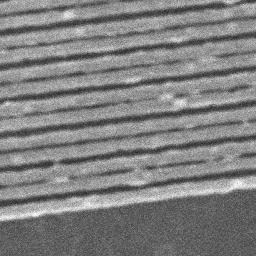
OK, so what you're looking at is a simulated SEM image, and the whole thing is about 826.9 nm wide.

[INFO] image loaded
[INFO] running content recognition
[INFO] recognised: parallel lines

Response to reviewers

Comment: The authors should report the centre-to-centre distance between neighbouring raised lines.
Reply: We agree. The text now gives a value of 55.1 nm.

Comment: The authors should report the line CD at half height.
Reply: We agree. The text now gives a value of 38.4 nm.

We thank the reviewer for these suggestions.